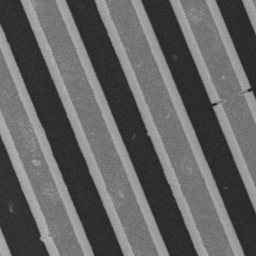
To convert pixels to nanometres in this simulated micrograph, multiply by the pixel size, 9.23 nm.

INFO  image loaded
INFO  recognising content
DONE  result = one or a few lines or trenches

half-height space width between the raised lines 340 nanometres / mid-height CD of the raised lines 298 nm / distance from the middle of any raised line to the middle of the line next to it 69.3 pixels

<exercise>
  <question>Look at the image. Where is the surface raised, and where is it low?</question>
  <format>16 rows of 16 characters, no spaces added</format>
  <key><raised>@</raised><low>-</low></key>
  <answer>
--@@--@@@--@@---
--@@---@@---@@--
---@@--@@---@@--
@--@@---@@--@@@-
@--@@@--@@---@@-
@---@@--@@@--@@-
@@--@@---@@---@@
@@---@@--@@@--@@
@@@--@@---@@--@@
-@@--@@@--@@---@
-@@---@@---@@--@
--@@--@@---@@---
--@@---@@--@@@--
--@@@--@@---@@--
---@@---@@--@@--
---@@---@@---@@-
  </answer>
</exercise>